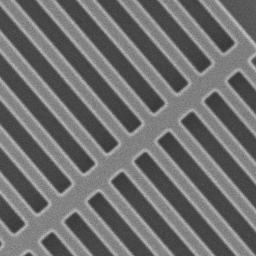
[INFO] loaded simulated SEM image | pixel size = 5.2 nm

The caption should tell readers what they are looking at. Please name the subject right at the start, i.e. groups of lines, slits or small figures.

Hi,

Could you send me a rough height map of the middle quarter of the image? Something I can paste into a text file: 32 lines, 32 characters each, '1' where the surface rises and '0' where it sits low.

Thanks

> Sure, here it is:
11000001111100000011110000001111
11100000111110000011111000000111
11100000011111000001111100000111
11110000001111000000111110000011
01111000000111100000011110000001
00111100000011110000001111000001
00111110000001111000000111100011
00011111000001111100000111111111
00001111100000111110000001111111
00000111100000011111000001111111
00000011110000001111000001111111
10000001111000000111100011111111
11000001111100000011111111111110
11100000111110000001111111111100
11110000011111000001111111111000
11110000001111100001111111111100
01111000000111110011111111111110
00111100000011111111111110011111
00011110000001111111111100001111
00011111000000111111111000000111
00001111100001111111111100000011
00000111110011111111111110000001
00000011111111111110011111000001
10000001111111111100001111100000
11000000111111111100000111100000
11100000111111111100000011110000
11110011111111111110000001111000
11111111111110011111000000111100
01111111111100001111100000111110
00111111111100000111110000011111
00111111111100000011110000001111
01111111111110000001111000000111